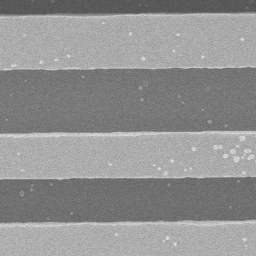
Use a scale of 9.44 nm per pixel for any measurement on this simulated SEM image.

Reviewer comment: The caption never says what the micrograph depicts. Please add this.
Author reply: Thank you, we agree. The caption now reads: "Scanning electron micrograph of lines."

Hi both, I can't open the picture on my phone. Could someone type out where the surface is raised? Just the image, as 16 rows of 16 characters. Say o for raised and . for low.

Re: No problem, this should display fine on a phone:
................
oooooooooooooooo
oooooooooooooooo
oooooooooooooooo
................
................
................
................
oooooooooooooooo
oooooooooooooooo
oooooooooooooooo
................
................
................
oooooooooooooooo
oooooooooooooooo